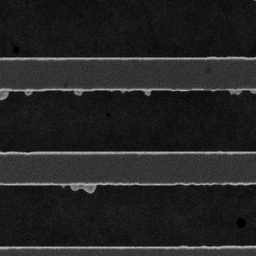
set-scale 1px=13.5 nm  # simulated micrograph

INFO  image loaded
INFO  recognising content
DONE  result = lines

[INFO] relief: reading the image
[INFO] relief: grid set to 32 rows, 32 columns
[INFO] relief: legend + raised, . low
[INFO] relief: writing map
................................
................................
................................
................................
................................
................................
................................
++++++++++++++++++++++++++++++++
++++++++++++++++++++++++++++++++
++++++++++++++++++++++++++++++++
++++++++++++++++++++++++++++++++
................................
................................
................................
................................
................................
................................
................................
................................
++++++++++++++++++++++++++++++++
++++++++++++++++++++++++++++++++
++++++++++++++++++++++++++++++++
++++++++++++++++++++++++++++++++
................................
................................
................................
................................
................................
................................
................................
................................
++++++++++++++++++++++++++++++++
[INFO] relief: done